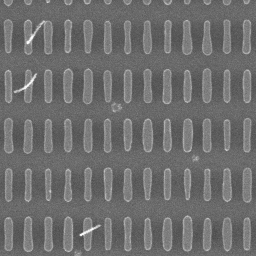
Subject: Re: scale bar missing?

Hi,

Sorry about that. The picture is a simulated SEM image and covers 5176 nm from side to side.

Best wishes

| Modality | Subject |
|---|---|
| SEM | groups of lines, slits or small figures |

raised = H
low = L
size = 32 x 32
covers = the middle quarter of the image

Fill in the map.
LLLLLLLLLLLLLLLLLLLLLLLLLLLLLLLL
LHLLLHHLLLLLLLLLLLLLHLLLLLLLLLLL
HHLLLHHLLLHHLLLHHLLLHHLLLHHLLLHH
HHLLLHHLLLHHLLLHHLLLHHLLLHHLLLHH
HHLLLHHLLLHHLLLHHLLLHHLLLHHLLLHH
HHLLLHHLLLHHLLLHHLLLHHLLLHHLLLHH
HHLLLHHLLLHHLLLHHLLLHHLLLHHLLLHH
HHLLLHHLLLHHLLLHHLLLHHLLLHHLLLHH
HHLLLHHLLLHHLLLHHLLLHHLLLHHLLLHH
LHLLLHHLLLLLLLLLLLLLHHLLLHHLLLLL
LLLLLLLLLLLLLLLLLLLLLLLLLLLLLLLL
LLLLLLLLLLLLLLLLLLLLLLLLLLLLLLLL
LLLLLLLLLLLLLLLLLLLLLLLLLLLLLLLL
LLLLLLLLLLLLLLLLLLLLLLLLLLLLLLLL
HHLLLHHLLLHHLLLHHLLLHHLLLHHLLLHH
HHLLLHHLLLHHLLLHHLLLHHLLLHHLLLHH
HHLLLHHLLLHHLLLHHLLLHHLLLHHLLLHH
HHLLLHHLLLHHLLLHHLLLHHLLLHHLLLHH
HHLLLHHLLLHHLLLHHLLLHHLLLHHLLLHH
HHLLLHHLLLHHLLLHHLLLHHLLLHHLLLHH
HHLLLHHLLLHHLLLHHLLLHHLLLHHLLLHH
HHLLLHHLLLHHLLLLLLLLHHLLLHHLLLHH
LLLLLLLLLLLLLLLLLLLLLLLLLLLLLLLL
LLLLLLLLLLLLLLLLLLLLLLLLLLLLLLLL
LLLLLLLLLLLLLLLLLLLLLLLLLLLLLLLL
LLLLLLLLLLLLLLLLLLLLLLLLLLLLLLLL
LLLLLHHLLLHHLLLLLLLLHHLLLLLLLLLL
LHLLLHHLLLHHLLLHHLLLHHLLLHHLLLHH
LHLLLHHLLLHHLLLHHLLLHHLLLHHLLLHH
LHLLLHHLLLHHLLLHHLLLHHLLLHHLLLHH
HHLLLHHLLLHHLLLHHLLLHHLLLHHLLLHH
HHLLLHHLLLHHLLLHHLLLHHLLLHHLLLHL